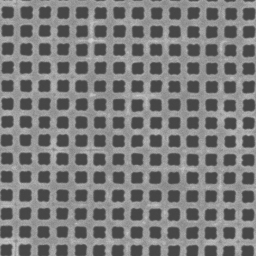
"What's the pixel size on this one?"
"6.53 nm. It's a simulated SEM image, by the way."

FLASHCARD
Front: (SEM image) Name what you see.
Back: a regular array of holes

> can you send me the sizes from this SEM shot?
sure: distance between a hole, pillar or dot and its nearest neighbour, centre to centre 118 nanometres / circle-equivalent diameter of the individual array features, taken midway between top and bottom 87.8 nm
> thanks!